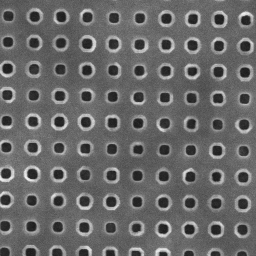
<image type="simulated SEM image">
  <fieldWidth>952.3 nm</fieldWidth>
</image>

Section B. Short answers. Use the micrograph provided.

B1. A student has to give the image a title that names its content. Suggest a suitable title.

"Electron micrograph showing a regular array of holes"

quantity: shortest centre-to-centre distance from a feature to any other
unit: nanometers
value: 95.7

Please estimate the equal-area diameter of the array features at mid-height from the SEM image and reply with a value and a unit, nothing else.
40.1 nm